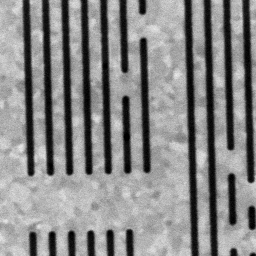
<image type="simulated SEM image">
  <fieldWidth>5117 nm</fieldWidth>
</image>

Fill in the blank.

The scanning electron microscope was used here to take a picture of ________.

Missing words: groups of lines, slits or small figures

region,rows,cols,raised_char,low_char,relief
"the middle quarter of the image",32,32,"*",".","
..**...**...**..***..*********..
..**...**..***..***..*********..
..**...**..********..*********..
..**...**..********..*********..
..**...**..********..*********..
..***..**..********..*********..
..***..**..********..**********.
..***..**...*******..**********.
..***..**...***.***..**********.
..***..**...**...**..**********.
..***..**...**...**...*********.
..***..**...**...**...*********.
..***..**...**...**...*********.
..***..***..***..**...*********.
..***..***..***..**...*********.
..***..***..***..**...*********.
..***..***..***..**...*********.
..***..***..***..**...*********.
..***..***..***..**...*********.
..***..***..***..**...*********.
..***..***..***..**...*********.
..***..***..***..***..*********.
..***..***..***..***..*********.
..***..***..***..***..*********.
..***..***..***..***..*********.
..***..***..***..***..*********.
..***..***..***..***..*********.
*.****.************************.
*******************************.
*******************************.
*******************************.
*******************************.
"